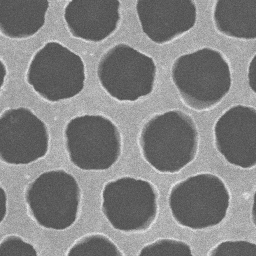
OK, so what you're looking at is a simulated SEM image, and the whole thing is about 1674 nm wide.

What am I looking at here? a regular array of holes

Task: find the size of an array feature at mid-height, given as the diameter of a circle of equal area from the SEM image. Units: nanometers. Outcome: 367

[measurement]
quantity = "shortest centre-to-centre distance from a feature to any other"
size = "454 nanometers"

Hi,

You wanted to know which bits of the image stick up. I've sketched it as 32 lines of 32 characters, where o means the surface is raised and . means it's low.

......ooo......oo.......ooo.....
......oo.......oo.......ooo.....
......oo.......oo.......ooo.....
.....oooo.....oooo......ooo.....
o...ooooo....ooooo....ooooooo...
oooooo.ooooooooooooooooooooooooo
ooooo....ooooo...ooooooo...ooooo
oooo......ooo......ooo......ooo.
.ooo......oo.......ooo.......oo.
.ooo.......o.......ooo.......oo.
oooo.......oo......ooo.......oo.
ooooo.....oooo.....ooo......oooo
oooooo.oooooooo..oooooo....ooooo
oo.oooooooooooooooooooooooooo...
....oooooo..oooooooo...ooooo....
.....oooo.....oooo......ooo.....
......oo.......ooo.......oo.....
......oo.......ooo......ooo.....
......ooo......ooo.......oo.....
.....oooo......ooo......oooo....
o..oooooo.....ooooo....oooooo...
oooooo..oooooooooooo..oooooooooo
oooo.....oooooo...ooooo.....oooo
oooo......ooo......ooo......oooo
.oo.......ooo......oo........ooo
.ooo......ooo......oo........ooo
.ooo......ooo.......o.......oooo
ooooo....ooooo.....ooo......oooo
oooooo..oooooo....oooooo..oooooo
oooooooooooooooooooooooooooooooo
....oooooo....ooooo....oooo.....
.....oooo......ooo......ooo.....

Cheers